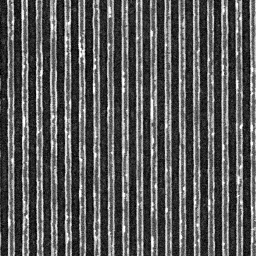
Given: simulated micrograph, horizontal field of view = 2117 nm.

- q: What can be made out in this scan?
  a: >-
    parallel lines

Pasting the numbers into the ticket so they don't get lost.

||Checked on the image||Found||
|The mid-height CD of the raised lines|50.7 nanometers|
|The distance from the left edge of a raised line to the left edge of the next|118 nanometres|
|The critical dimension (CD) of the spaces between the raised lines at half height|0.0662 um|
